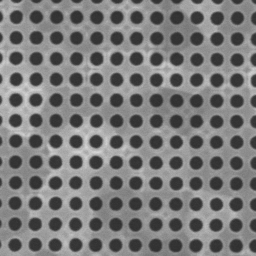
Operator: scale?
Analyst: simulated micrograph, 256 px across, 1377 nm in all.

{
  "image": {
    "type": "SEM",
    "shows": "a regular array of holes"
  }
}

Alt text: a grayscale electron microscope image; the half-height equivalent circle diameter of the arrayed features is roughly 77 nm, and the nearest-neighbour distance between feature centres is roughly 107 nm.